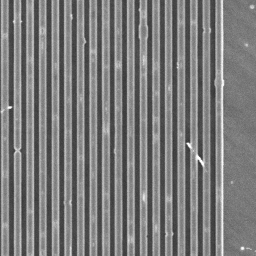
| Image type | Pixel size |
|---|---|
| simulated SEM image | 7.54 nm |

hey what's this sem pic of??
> parallel lines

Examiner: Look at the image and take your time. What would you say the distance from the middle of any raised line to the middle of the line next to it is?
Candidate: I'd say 12.6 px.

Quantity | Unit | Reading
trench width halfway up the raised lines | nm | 42.4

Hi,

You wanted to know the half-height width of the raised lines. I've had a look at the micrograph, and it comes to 49.9 nanometres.